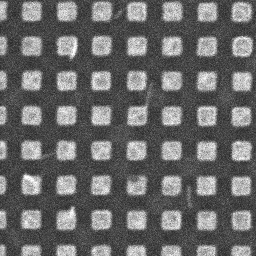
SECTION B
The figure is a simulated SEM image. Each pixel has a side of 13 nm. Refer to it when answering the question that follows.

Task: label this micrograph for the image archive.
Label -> a regular array of raised bodies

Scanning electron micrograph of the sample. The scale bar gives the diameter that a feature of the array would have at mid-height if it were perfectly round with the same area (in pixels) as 19.9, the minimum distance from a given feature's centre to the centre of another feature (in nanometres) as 446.